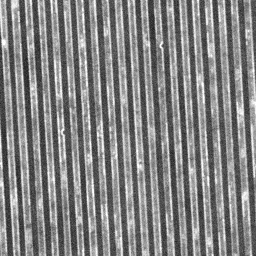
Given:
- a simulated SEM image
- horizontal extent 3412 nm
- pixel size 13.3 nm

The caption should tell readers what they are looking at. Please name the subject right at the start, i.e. parallel lines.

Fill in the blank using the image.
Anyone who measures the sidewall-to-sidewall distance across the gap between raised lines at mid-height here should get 91.5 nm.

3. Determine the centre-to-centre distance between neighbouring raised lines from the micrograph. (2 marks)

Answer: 171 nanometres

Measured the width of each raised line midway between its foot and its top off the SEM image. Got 79.9 nm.